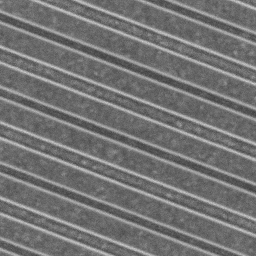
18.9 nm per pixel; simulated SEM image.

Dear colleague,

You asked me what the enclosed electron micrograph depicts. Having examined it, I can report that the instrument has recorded parallel lines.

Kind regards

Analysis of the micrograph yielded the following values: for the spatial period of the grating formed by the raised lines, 667 nm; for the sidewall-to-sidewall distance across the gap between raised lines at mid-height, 194 nanometres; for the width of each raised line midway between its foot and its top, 434 nm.